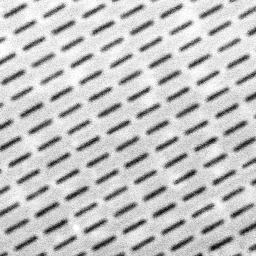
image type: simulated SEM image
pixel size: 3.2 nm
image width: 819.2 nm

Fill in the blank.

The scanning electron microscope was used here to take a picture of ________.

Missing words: a regular array of holes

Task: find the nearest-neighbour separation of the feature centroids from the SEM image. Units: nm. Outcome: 60.2